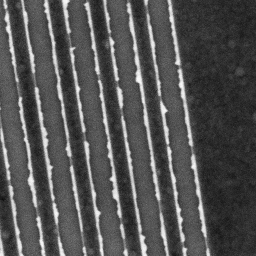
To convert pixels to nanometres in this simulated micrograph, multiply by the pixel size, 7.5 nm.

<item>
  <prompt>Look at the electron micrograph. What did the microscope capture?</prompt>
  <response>parallel lines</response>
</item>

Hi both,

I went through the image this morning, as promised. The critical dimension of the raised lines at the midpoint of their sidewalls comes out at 152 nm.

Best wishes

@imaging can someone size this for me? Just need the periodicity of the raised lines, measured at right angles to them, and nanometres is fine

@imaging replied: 304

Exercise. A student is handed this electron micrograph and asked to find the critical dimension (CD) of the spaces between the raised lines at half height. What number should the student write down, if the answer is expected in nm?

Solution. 152